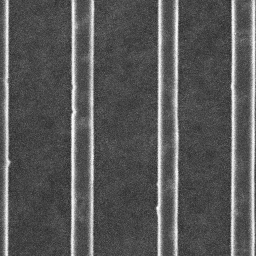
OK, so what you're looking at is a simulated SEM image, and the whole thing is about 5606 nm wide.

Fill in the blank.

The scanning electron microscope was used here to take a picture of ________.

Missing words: one or a few lines or trenches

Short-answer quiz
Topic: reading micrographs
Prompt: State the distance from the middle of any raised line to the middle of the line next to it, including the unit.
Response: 1.76 µm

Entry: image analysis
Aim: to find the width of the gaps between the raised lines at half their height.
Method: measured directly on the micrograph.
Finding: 1.42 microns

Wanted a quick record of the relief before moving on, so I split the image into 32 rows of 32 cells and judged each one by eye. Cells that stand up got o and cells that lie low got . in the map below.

o........ooo........oo.......ooo
o........ooo........oo.......ooo
o........ooo........oo.......ooo
o........ooo........oo.......ooo
o........ooo........oo.......ooo
o........ooo........oo.......ooo
o........ooo........oo.......ooo
o........ooo........oo.......ooo
o........ooo........oo.......ooo
o........ooo........oo.......ooo
o........ooo........oo.......ooo
o........ooo........oo.......ooo
o........ooo........oo.......ooo
o........ooo........oo.......ooo
o........ooo........oo.......ooo
o........ooo........oo.......ooo
o........ooo........oo.......ooo
o........ooo........oo.......ooo
o........ooo........oo.......ooo
o........ooo........oo.......ooo
o........oo.........oo.......ooo
o........oo.........oo.......ooo
o........oo.........oo.......ooo
o........oo.........oo.......ooo
o........oo.........oo.......ooo
o........oo.........oo.......ooo
o........oo.........oo.......ooo
o........oo.........oo.......ooo
o........oo.........oo.......ooo
o........oo.........oo.......ooo
o........oo.........oo.......ooo
o........oo.........oo.......ooo